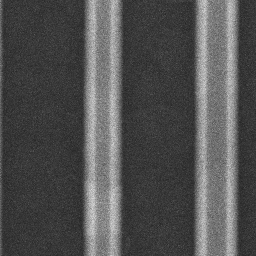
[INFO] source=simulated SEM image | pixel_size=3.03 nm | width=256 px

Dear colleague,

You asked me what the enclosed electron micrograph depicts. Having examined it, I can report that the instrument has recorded one or a few lines or trenches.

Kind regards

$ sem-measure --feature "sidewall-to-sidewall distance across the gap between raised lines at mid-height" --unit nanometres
258